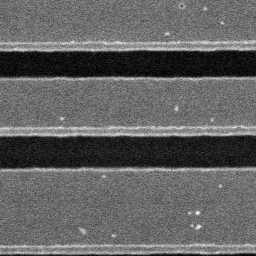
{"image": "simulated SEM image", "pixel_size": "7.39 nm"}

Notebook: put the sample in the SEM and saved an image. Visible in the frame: lines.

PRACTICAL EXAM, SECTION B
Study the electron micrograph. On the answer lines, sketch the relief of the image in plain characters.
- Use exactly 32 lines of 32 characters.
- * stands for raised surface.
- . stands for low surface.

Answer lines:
********************************
********************************
********************************
********************************
********************************
********************************
................................
................................
................................
................................
********************************
********************************
********************************
********************************
********************************
********************************
********************************
................................
................................
................................
................................
********************************
********************************
********************************
********************************
********************************
********************************
********************************
********************************
********************************
********************************
********************************